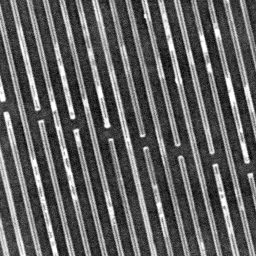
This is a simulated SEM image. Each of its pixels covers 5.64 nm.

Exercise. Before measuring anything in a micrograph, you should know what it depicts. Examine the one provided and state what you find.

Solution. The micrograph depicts parallel lines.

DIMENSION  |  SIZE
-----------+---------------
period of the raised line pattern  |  90.2 nm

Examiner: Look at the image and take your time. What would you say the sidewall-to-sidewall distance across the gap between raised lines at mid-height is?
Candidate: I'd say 11.9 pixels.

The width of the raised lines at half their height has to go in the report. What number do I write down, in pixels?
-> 4.02